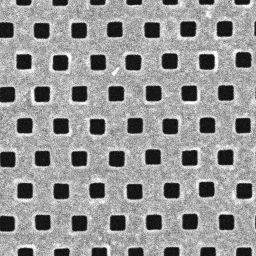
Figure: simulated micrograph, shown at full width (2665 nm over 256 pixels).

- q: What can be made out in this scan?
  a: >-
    a regular array of holes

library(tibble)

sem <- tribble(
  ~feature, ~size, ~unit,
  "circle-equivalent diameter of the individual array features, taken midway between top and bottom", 0.184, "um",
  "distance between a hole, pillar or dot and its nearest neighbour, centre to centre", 374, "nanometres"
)